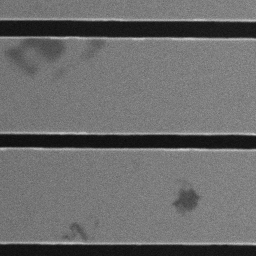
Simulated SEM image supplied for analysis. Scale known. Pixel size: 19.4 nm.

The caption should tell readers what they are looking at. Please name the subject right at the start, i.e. lines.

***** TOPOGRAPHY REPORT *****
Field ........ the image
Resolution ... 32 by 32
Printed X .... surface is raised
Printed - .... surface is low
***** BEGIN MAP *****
XXXXXXXXXXXXXXXXXXXXXXXXXXXXXXXX
XXXXXXXXXXXXXXXXXXXXXXXXXXXXXXXX
----------XXXXXXXXXXXXXXXXXXXXXX
--------------------------------
--------------------------------
XXXXXXXXXXXXXXXXXXXXXXXXXXXXXXXX
XXXXXXXXXXXXXXXXXXXXXXXXXXXXXXXX
XXXXXXXXXXXXXXXXXXXXXXXXXXXXXXXX
XXXXXXXXXXXXXXXXXXXXXXXXXXXXXXXX
XXXXXXXXXXXXXXXXXXXXXXXXXXXXXXXX
XXXXXXXXXXXXXXXXXXXXXXXXXXXXXXXX
XXXXXXXXXXXXXXXXXXXXXXXXXXXXXXXX
XXXXXXXXXXXXXXXXXXXXXXXXXXXXXXXX
XXXXXXXXXXXXXXXXXXXXXXXXXXXXXXXX
XXXXXXXXXXXXXXXXXXXXXXXXXXXXXXXX
XXXXXXXXXXXXXXXXXXXXXXXXXXXXXXXX
XXXXXXXXXXXXXXXXXXXXXXXXXXXXXXXX
--------------------------------
--------------------------------
XXXXXXXXXXXXXXXXXXXXXXXXXXXXXXXX
XXXXXXXXXXXXXXXXXXXXXXXXXXXXXXXX
XXXXXXXXXXXXXXXXXXXXXXXXXXXXXXXX
XXXXXXXXXXXXXXXXXXXXXXXXXXXXXXXX
XXXXXXXXXXXXXXXXXXXXXXXXXXXXXXXX
XXXXXXXXXXXXXXXXXXXXXXXXXXXXXXXX
XXXXXXXXXXXXXXXXXXXXXXXXXXXXXXXX
XXXXXXXXXXXXXXXXXXXXXXXXXXXXXXXX
XXXXXXXXXXXXXXXXXXXXXXXXXXXXXXXX
XXXXXXXXXXXXXXXXXXXXXXXXXXXXXXXX
XXXXXXXXXXXXXXXXXXXXXXXXXXXXXXXX
-----------------------------XXX
--------------------------------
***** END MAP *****